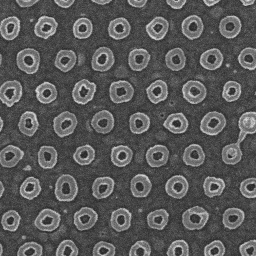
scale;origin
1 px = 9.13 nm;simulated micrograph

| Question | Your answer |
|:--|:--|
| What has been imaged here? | a regular array of ring-shaped raised bodies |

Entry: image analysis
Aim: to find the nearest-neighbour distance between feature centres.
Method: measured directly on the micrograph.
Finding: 327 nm